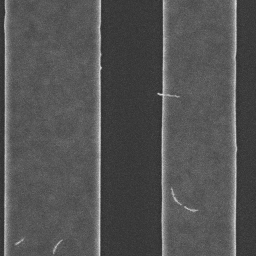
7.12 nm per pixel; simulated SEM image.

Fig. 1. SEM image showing one or a few lines or trenches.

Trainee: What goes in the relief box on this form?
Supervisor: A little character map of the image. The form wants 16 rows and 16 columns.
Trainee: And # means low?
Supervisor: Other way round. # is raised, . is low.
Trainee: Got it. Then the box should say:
######....#####.
######....#####.
######....#####.
######....#####.
######....#####.
######....#####.
######....#####.
######....#####.
######....#####.
######....#####.
######....#####.
######....#####.
######....#####.
######....#####.
######....#####.
######....#####.